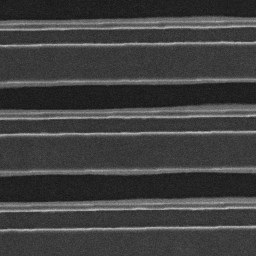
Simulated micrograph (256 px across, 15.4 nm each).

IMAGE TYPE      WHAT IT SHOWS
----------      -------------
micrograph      lines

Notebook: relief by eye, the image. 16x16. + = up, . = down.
................
++++++++++++++++
++++++++++++++++
++++++++++++++++
++++++++++++++++
................
................
++++++++++++++++
++++++++++++++++
++++++++++++++++
++++++++++++++++
................
................
++++++++++++++++
++++++++++++++++
++++++++++++++++